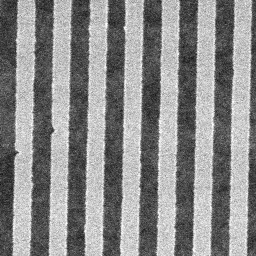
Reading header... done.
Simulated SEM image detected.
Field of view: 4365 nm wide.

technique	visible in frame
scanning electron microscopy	parallel lines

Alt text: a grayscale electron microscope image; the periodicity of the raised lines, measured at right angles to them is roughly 614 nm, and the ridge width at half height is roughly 281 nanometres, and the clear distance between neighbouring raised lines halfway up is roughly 334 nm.